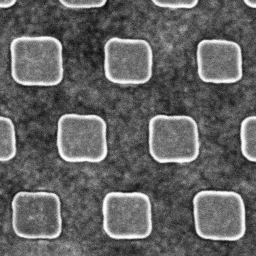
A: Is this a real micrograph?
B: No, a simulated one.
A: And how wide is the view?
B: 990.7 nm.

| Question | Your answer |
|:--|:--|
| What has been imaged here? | raised bodies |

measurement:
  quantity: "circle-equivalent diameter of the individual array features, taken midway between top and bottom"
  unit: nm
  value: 197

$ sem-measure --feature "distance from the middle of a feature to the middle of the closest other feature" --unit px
89.4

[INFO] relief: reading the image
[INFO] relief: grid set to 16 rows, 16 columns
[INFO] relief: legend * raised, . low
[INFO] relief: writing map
................
................
.**....*........
.***...**...***.
.***...**...***.
................
................
....**....**...*
*...***..***...*
*...***..***...*
................
................
.......**...***.
.......**...***.
.......**...***.
................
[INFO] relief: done